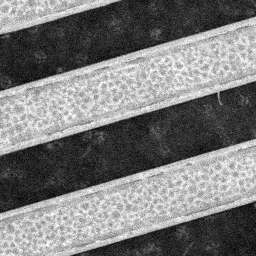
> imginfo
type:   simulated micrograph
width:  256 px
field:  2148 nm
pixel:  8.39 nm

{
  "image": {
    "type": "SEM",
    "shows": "one or a few lines or trenches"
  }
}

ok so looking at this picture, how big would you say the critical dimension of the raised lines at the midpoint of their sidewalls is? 461 nm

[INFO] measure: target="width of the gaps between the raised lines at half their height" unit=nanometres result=507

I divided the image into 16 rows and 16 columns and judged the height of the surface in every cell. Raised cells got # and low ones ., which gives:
#####...........
##.............#
............####
........########
.....###########
.#############..
##########......
#######.........
###.............
..............##
..........######
.......#########
...#############
############....
#########.......
#####...........